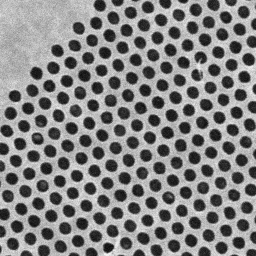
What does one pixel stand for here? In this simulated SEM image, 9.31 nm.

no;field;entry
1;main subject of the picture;a regular array of holes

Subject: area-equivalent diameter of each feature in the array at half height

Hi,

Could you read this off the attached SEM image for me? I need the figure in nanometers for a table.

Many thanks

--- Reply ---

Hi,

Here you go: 122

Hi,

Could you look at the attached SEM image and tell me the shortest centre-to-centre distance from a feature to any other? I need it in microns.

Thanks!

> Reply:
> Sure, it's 0.165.